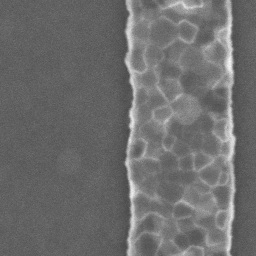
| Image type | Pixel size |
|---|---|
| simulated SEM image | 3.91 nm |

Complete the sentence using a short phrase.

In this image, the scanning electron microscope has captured one or a few lines or trenches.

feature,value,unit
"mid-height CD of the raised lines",393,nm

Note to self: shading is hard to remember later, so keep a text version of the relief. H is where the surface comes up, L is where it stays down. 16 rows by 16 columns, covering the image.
LLLLLLLLHHHHHHLL
LLLLLLLLHHHHHHLL
LLLLLLLLHHHHHHLL
LLLLLLLLHHHHHHLL
LLLLLLLLHHHHHHLL
LLLLLLLLHHHHHHLL
LLLLLLLLHHHHHHLL
LLLLLLLLHHHHHHLL
LLLLLLLLHHHHHHLL
LLLLLLLLHHHHHHLL
LLLLLLLLHHHHHHLL
LLLLLLLLHHHHHHHL
LLLLLLLLHHHHHHLL
LLLLLLLLHHHHHHLL
LLLLLLLLHHHHHHLL
LLLLLLLLHHHHHHLL